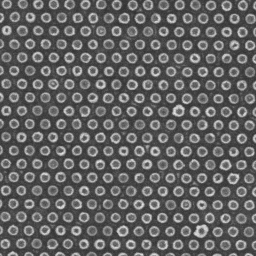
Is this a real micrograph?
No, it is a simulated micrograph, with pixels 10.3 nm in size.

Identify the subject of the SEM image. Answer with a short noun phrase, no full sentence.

a regular array of raised bodies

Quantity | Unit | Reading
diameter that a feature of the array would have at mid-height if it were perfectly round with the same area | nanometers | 98.7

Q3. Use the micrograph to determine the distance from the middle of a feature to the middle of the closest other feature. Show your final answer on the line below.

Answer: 15.1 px